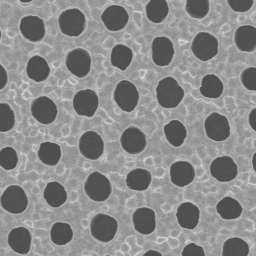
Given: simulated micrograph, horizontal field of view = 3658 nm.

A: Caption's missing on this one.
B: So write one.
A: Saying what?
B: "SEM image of a regular array of holes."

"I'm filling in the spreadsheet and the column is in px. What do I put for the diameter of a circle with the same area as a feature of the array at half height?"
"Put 25.1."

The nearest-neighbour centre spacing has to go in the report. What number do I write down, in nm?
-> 576